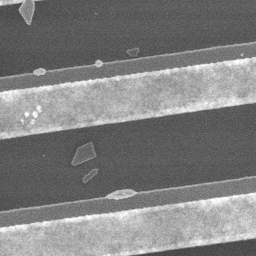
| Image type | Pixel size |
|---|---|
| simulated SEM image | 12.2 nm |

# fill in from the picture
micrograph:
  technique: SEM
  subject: lines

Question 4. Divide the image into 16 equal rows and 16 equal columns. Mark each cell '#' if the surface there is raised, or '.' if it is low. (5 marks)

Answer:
.#..............
................
................
..........######
..##############
################
###############.
########........
#...............
................
................
............####
......##########
################
################
###########.....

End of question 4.